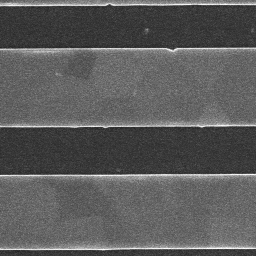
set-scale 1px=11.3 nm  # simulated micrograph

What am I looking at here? one or a few lines or trenches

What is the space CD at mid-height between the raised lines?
0.524 um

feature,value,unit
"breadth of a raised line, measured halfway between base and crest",843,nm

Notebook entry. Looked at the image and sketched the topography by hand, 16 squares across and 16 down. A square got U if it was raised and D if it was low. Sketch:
DDDDDDDDDDDDDDDD
DDDDDDDDDDDDDDDD
DDDDDDDDDDDDDDDD
UUUUUUUUUUUUUUUU
UUUUUUUUUDUUUUUU
UUUUUUUUUUUUUUUU
UUUUUUUUUUUUUUUU
UUUUUUUUUUUUUUUU
DDDDDDDDDDDDDDDD
DDDDDDDDDDDDDDDD
DDDDDDDDDDDDDDDD
UUUUUUUUUUUUUUUU
UUUUUUUUUUUUUUUU
UUUUUUUUUUUUUUUU
UUUUUUUUUUUUUUUU
UUUUUUUUUUUUUUUU